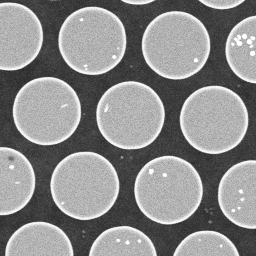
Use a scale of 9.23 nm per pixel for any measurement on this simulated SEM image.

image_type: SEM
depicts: an array of small figures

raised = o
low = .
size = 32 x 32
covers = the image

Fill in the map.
oo...............o........oooo..
oooo.....ooooo.......o..........
ooooo...ooooooo....oooooo.....oo
ooooo...ooooooo...oooooooo...ooo
ooooo..ooooooooo..oooooooo...ooo
ooooo..ooooooooo..oooooooo..oooo
ooooo...oooooooo..oooooooo..oooo
oooo....ooooooo...oooooooo..oooo
ooo......ooooo.....oooooo....ooo
....................oooo......oo
...ooooo.......ooo..............
..ooooooo....oooooo.....ooooo...
..oooooooo..oooooooo...ooooooo..
..oooooooo..oooooooo...oooooooo.
..oooooooo..ooooooooo..oooooooo.
..oooooooo..oooooooo...oooooooo.
...oooooo....ooooooo...oooooooo.
....oooo.....oooooo....ooooooo..
o..............ooo......ooooo...
ooo......oooo...................
oooo...ooooooo....oooooo......oo
oooo...ooooooo...oooooooo...oooo
oooo..ooooooooo..oooooooo...oooo
oooo..ooooooooo..oooooooo..ooooo
oooo...oooooooo..oooooooo..ooooo
ooo....ooooooo...oooooooo..ooooo
oo......ooooo.....oooooo....oooo
...................oooo......ooo
...oooo.......ooo..............o
.ooooooo....oooooo......oooo....
.oooooooo...ooooooo...ooooooo...
.oooooooo..oooooooo...oooooooo..